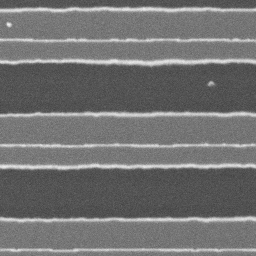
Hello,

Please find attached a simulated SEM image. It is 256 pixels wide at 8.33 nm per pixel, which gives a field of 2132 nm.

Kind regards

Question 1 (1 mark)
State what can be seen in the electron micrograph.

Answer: lines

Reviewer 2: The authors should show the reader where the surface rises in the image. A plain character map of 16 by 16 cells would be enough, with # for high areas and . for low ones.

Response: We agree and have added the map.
................
################
################
################
................
................
................
################
################
################
................
................
................
................
################
################